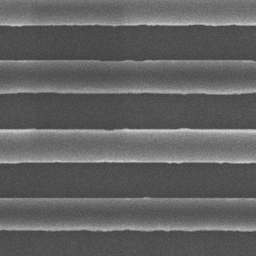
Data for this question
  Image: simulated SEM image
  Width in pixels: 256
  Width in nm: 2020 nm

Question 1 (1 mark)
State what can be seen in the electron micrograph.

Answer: lines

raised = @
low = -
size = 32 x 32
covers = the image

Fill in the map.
@@@@@@@@@@@@@@@@@@@@@@@@@@@@@@@@
@@@@@@@@@@@@@@@@@@@@@@@@@@@@@@@@
@@@@@@@@@@@@@@@@@@@@@@@@@@@@@@@@
--------------------------------
--------------------------------
--------------------------------
--------------------------------
--------------------------------
@@@@@@@@@@@@@@@@@@@@@@@@@@@@@@@@
@@@@@@@@@@@@@@@@@@@@@@@@@@@@@@@@
@@@@@@@@@@@@@@@@@@@@@@@@@@@@@@@@
@@-----@-@@@@@@@@@-@@@@@@@@@@@@-
--------------------------------
--------------------------------
--------------------------------
--------------------------------
@@@@@@@@@@@@@@@@@@@@@@@@@@@@@@@@
@@@@@@@@@@@@@@@@@@@@@@@@@@@@@@@@
@@@@@@@@@@@@@@@@@@@@@@@@@@@@@@@@
@@@@@@@@@@@@@@@@@@@@@@@@@@@@@@@@
--------------------------------
--------------------------------
--------------------------------
--------------------------------
--------------------------------
@@@@@@@@@@@@@@@@@@@@@@@@@@@@@@@@
@@@@@@@@@@@@@@@@@@@@@@@@@@@@@@@@
@@@@@@@@@@@@@@@@@@@@@@@@@@@@@@@@
@@@@@@@@@@@@@@@@@@@@@@@@@@@@@@@@
--------------------------------
--------------------------------
--------------------------------